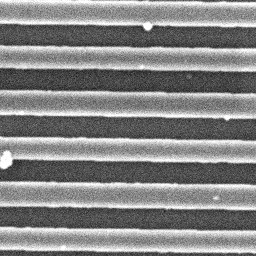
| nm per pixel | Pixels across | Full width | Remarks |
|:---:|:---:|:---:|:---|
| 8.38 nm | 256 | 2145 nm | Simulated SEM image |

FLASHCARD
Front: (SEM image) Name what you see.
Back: lines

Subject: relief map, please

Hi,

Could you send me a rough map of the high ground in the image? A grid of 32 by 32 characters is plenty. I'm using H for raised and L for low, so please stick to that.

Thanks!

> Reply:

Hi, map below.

HHHHHHHHHHHHHHHHHHHHHHHHHHHHHHHH
HHHHHHHHHHHHHHHHHHHHHHHHHHHHHHHH
HHHHHHHHHHHHHHHHHHHHHHHHHHHHHHHH
LLLLLLLLLLLLLLLLLLHLLLLLLLLLLLLL
LLLLLLLLLLLLLLLLLLLLLLLLLLLLLLLL
LLLLLLLLLLLLLLLLLLLLLLLLLLLLLLLL
HHHHHHHHHHHHHHHHHHHHHHHHHHHHHHHH
HHHHHHHHHHHHHHHHHHHHHHHHHHHHHHHH
LLHHHHHHHHHHHHHHHHHHHHHHHHHHHHHH
LLLLLLLLLLLLLLLLLLLLLLLLLLLLLLLL
LLLLLLLLLLLLLLLLLLLLLLLLLLLLLLLL
HHHHHHHHHHHHHHLLLLLLLLLLLLLLLLLL
HHHHHHHHHHHHHHHHHHHHHHHHHHHHHHHH
HHHHHHHHHHHHHHHHHHHHHHHHHHHHHHHH
LLLLLLLLLLLLLHHHHHHHHHHHHHHHHHHH
LLLLLLLLLLLLLLLLLLLLLLLLLLLLLLLL
LLLLLLLLLLLLLLLLLLLLLLLLLLLLLLLL
HHHHHHHHHHHHHHHHHHHHHHLLLLLLLLLL
HHHHHHHHHHHHHHHHHHHHHHHHHHHHHHHH
HHHHHHHHHHHHHHHHHHHHHHHHHHHHHHHH
HLLLLLLLLLLLLLLLLLLLLLLLLLLLLLLL
LLLLLLLLLLLLLLLLLLLLLLLLLLLLLLLL
LLLLLLLLLLLLLLLLLLLLLLLLLLLLLLLL
HHHHHHHHHHHHHHHHHHHHHHHHHHHHHHHH
HHHHHHHHHHHHHHHHHHHHHHHHHHHHHHHH
HHHHHHHHHHHHHHHHHHHHHHHHHHHHHHHH
LLLLLLLLLLLLLLLLLLLLLLLLLLLLLLLL
LLLLLLLLLLLLLLLLLLLLLLLLLLLLLLLL
HHLHLLLLLLLLLLLLLLLLLLLLLLLLLLLL
HHHHHHHHHHHHHHHHHHHHHHHHHHHHHHHH
HHHHHHHHHHHHHHHHHHHHHHHHHHHHHHHH
LLLLLLLLLLLLLLLLLLLLLLLLLLLLLLLL